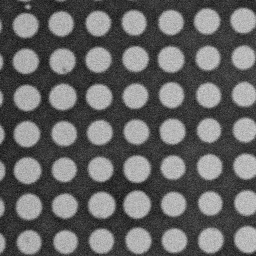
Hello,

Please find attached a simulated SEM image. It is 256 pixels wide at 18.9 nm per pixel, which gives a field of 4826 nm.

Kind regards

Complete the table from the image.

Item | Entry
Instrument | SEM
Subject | an array of small figures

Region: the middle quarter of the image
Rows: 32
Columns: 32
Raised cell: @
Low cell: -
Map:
@@----@@@@@----@@@@@----@@@@@---
@@-----@@@-------@@------@@@----
--------------------------------
--------------------------------
--------------------------------
@------@@@------@@@@-----@@@@---
@@----@@@@@----@@@@@----@@@@@@--
@@@---@@@@@@---@@@@@@---@@@@@@--
@@@---@@@@@@---@@@@@@---@@@@@@--
@@@---@@@@@@---@@@@@----@@@@@---
@@-----@@@@-----@@@-------@@----
--------------------------------
--------------------------------
--------------------------------
--------@@------@@@@-----@@@@---
@@-----@@@@-----@@@@@---@@@@@@--
@@@---@@@@@@---@@@@@@---@@@@@@--
@@@---@@@@@@---@@@@@@---@@@@@@--
@@@---@@@@@@----@@@@@---@@@@@@--
@@-----@@@@------@@@-----@@@@---
--------------------------------
--------------------------------
--------------------------------
--------@@------@@@@------@@@---
@@-----@@@@-----@@@@@----@@@@@--
@@@---@@@@@@---@@@@@@---@@@@@@--
@@@---@@@@@@---@@@@@@---@@@@@@--
@@@---@@@@@@---@@@@@@----@@@@@--
@@-----@@@@-----@@@@@-----@@----
------------------@-------------
--------------------------------
--------------------------------